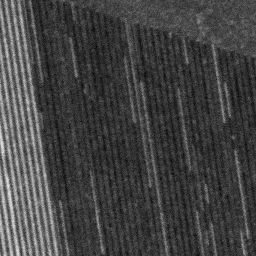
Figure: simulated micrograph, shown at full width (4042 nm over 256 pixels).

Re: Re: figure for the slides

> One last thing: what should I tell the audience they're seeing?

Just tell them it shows parallel lines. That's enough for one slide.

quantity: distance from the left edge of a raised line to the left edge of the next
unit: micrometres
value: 0.1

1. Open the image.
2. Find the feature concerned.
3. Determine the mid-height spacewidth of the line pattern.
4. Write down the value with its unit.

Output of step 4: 0.0703 µm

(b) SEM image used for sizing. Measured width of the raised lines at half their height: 31.2 nanometres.